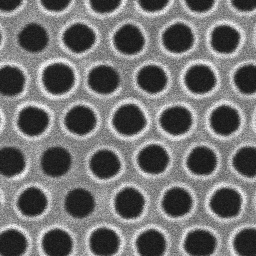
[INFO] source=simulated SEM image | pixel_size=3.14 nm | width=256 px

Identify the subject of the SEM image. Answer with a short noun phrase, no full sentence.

a regular array of holes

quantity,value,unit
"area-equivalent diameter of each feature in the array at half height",96.6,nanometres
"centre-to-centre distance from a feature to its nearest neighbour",146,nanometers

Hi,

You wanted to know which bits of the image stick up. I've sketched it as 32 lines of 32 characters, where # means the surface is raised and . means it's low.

...##....##....##....##....##...
############..####..####..####.#
################################
###..###...####..####...###..###
##....##....##....##....##....##
##....##....##....##....##....##
####.####.#####..####..####..###
################################
..####...###..####..####..####..
...##....##....##....##....##...
...##....##....##....##....##...
...###..####..####..####..####..
################################
###..####..####..####..####..###
##....##....##....##....##....##
##....##....##....##....##....##
###..####..####...###..####..###
################################
..####..##########..####..####..
...##....##....##....###...##...
...##....##....##....##....##...
...##...###....###..####...###..
################################
###..###########.###############
##....##....###...##....###...##
##....##....##....##....##....##
###..###...####...###...###...##
################################
############..##################
...##....##....##...###....###..
...##....##....##....##....##...
...###...###...##....##....###..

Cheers